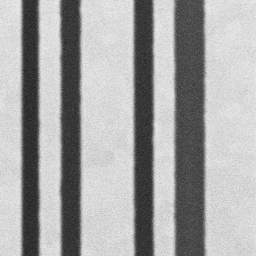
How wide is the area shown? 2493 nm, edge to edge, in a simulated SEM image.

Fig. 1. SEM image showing lines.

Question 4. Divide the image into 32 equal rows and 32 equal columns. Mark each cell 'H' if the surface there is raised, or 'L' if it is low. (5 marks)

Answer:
HHHLLHHLLLHHHHHHHLLHHHLLLLHHHHHH
HHHLLHHLLLHHHHHHHLLHHHLLLLHHHHHH
HHHLLHHHLLHHHHHHHLLHHHLLLLHHHHHH
HHHLLHHLLLHHHHHHHLLHHHLLLLHHHHHH
HHHLLHHLLLHHHHHHHLLHHHLLLLHHHHHH
HHHLLHHHLLHHHHHHHLLHHHLLLLHHHHHH
HHHLLHHHLLHHHHHHHLLHHHLLLLHHHHHH
HHHLLHHHLLHHHHHHHLLHHHLLLLHHHHHH
HHHLLHHHLLHHHHHHHLLHHHLLLLHHHHHH
HHHLLHHHLLHHHHHHHLLHHHLLLLHHHHHH
HHHLLHHHLLHHHHHHHLLHHHLLLLHHHHHH
HHHLLHHHLLHHHHHHHLLHHHLLLLHHHHHH
HHHLLHHHLLHHHHHHHLLHHHLLLLHHHHHH
HHHLLHHHLLHHHHHHHLLHHHLLLLHHHHHH
HHHLLHHHLLHHHHHHHLLHHHLLLLHHHHHH
HHHLLHHHLLHHHHHHHLLHHHLLLLHHHHHH
HHHLLHHHLLHHHHHHHLLHHHLLLLHHHHHH
HHHLLHHHLLHHHHHHHLLHHHLLLLHHHHHH
HHHLLHHHLLHHHHHHHLLHHHLLLLHHHHHH
HHHLLHHHLLHHHHHHHLLHHHLLLLHHHHHH
HHHLLHHHLLHHHHHHHLLHHHLLLLHHHHHH
HHHLLHHHLLHHHHHHHLLHHHLLLLHHHHHH
HHHLLHHHLLHHHHHHHLLHHHLLLLHHHHHH
HHHLLHHLLLHHHHHHHLLHHHLLLLHHHHHH
HHHLLHHHLLHHHHHHHLLHHHLLLLHHHHHH
HHHLLHHHLLHHHHHHHLLHHHLLLLHHHHHH
HHHLLHHHLLHHHHHHHLLHHHLLLLHHHHHH
HHHLLHHHLLHHHHHHHLLHHHLLLLHHHHHH
HHHLLHHHLLHHHHHHHLLHHHLLLLHHHHHH
HHHLLHHHLLHHHHHHHLLHHHLLLLHHHHHH
HHHLLHHHLLHHHHHHHLLHHHLLLLHHHHHH
HHHLLHHHLLHHHHHHHLLHHHLLLLHHHHHH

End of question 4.